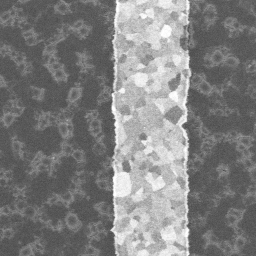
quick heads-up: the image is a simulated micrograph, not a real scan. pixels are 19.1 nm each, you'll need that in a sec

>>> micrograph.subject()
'one or a few lines or trenches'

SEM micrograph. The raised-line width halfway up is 1350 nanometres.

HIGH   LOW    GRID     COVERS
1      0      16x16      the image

0000000111110000
0000000111110000
0000000111110000
0000000111110000
0000000111110000
0000000111110000
0000000111110000
0000000111110000
0000000111110000
0000000111110000
0000000111110000
0000000111110000
0000000111110000
0000000111110000
0000000111110000
0000000111110000